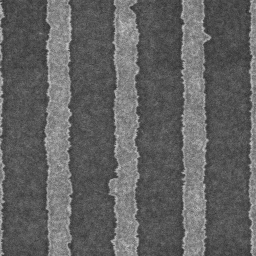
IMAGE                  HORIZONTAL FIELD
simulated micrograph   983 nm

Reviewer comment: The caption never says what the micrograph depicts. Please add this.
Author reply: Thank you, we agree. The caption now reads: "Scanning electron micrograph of one or a few lines or trenches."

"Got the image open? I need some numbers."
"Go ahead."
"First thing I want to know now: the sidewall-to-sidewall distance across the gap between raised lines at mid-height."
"0.177 µm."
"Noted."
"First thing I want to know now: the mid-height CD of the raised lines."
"82.6 nanometers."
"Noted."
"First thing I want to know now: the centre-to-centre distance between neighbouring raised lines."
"260 nm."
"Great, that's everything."